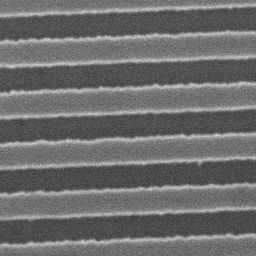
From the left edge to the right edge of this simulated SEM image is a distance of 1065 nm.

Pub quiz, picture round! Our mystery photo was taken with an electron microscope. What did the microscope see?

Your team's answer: lines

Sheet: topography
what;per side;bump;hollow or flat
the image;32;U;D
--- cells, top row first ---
UUUUUUUUUUUUUUUUUUUUUUUUUUUUUUUU
UUUUUUUUUUUUUDDDDDDDDDDDDDDDDDDD
DDDDDDDDDDDDDDDDDDDDDDDDDDDDDDDD
DDDDDDDDDDDDDDDDDDDDDDDDDDDDDDDD
DDDDDDDDDDDDDDDDDUUUUUUUUUUUUUUU
UUUUUUUUUUUUUUUUUUUUUUUUUUUUUUUU
UUUUUUUUUUUUUUUUUUUUUUUUUUUUUUUU
UUUUUUUUUUUUUUUUUUUUUUUUDDDDDDDD
DDDDDDDDDDDDDDDDDDDDDDDDDDDDDDDD
DDDDDDDDDDDDDDDDDDDDDDDDDDDDDDDD
DDDDDDDDDDDDDDDDDDDDDDDDDUUDUUUU
DDUDUUUUUUUUUUUUUUUUUUUUUUUUUUUU
UUUUUUUUUUUUUUUUUUUUUUUUUUUUUUUU
UUUUUUUUUUUUUUUUUUUUUUUUUUUUUUUU
UUUUUUDDDDDDDDDDDDDDDDDDDDDDDDDD
DDDDDDDDDDDDDDDDDDDDDDDDDDDDDDDD
DDDDDDDDDDDDDDDDDDDDDDDDDDDDDDDD
DDDDDDDDDDDDUUUUUUUUUUUUUUUUUUUU
UUUUUUUUUUUUUUUUUUUUUUUUUUUUUUUU
UUUUUUUUUUUUUUUUUUUUUUUUUUUUUUUU
UUUUUUUUUUUUUUDDDDDDDDDDDDDDDDDD
DDDDDDDDDDDDDDDDDDDDDDDDDDDDDDDD
DDDDDDDDDDDDDDDDDDDDDDDDDDDDDDDD
DDDDDDDDDDDDDDDDDDDUUUUUUUUUUUUU
UUUUUUUUUUUUUUUUUUUUUUUUUUUUUUUU
UUUUUUUUUUUUUUUUUUUUUUUUUUUUUUUU
UUUUUUUUUUUUUUUUUUUUUUDDDDDDDDDD
DDDDDDDDDDDDDDDDDDDDDDDDDDDDDDDD
DDDDDDDDDDDDDDDDDDDDDDDDDDDDDDDD
DDDDDDDDDDDDDDDDDDDDDDDDDDDDUDUU
DDDUUUUUUUUUUUUUUUUUUUUUUUUUUUUU
UUUUUUUUUUUUUUUUUUUUUUUUUUUUUUUU